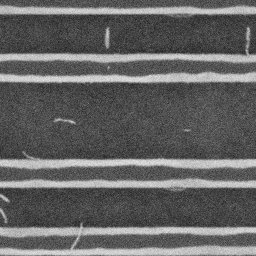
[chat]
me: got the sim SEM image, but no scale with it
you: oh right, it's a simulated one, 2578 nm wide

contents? lines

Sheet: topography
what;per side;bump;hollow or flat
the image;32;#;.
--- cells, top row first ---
################################
................................
................................
................................
................................
................................
................................
################################
################################
################################
................................
................................
................................
................................
................................
................................
................................
................................
................................
................................
###....################...###.##
################################
################################
................................
................................
................................
................................
................................
................................
################################
################################
.###########.######.##..........